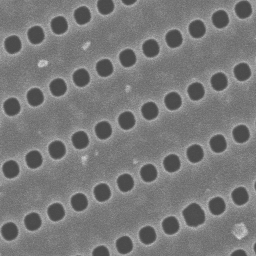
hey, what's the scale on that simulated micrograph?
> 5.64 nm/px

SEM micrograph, a regular array of holes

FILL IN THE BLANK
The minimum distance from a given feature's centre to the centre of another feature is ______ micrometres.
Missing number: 0.141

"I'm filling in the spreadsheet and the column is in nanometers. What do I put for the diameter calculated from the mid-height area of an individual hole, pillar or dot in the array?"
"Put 97.4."